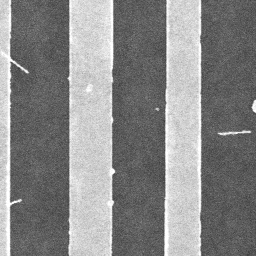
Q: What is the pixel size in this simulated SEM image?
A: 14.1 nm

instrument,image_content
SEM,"lines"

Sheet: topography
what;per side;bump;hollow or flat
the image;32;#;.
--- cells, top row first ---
#........#####.......####.......
#........#####.......####.......
#........#####.......####.......
#........#####.......####.......
#........#####.......####.......
#........#####.......####.......
#........#####.......####.......
#........#####.......####.......
#........#####.......####.......
#........#####.......####.......
#........#####.......####.......
#........#####.......####.......
#........#####.......####.......
#........#####.......####.......
#........#####.......####.......
#........#####.......####.......
#........#####.......####.......
#........#####.......####.......
#........#####.......####.......
#........#####.......####.......
#........#####.......####.......
#........#####.......####.......
#........#####.......####.......
#........#####.......####.......
#........#####.......####.......
#........#####.......####.......
#........#####.......####.......
#........#####.......####.......
#........#####.......####.......
#........#####.......####.......
#........#####.......####.......
#........#####.......####.......